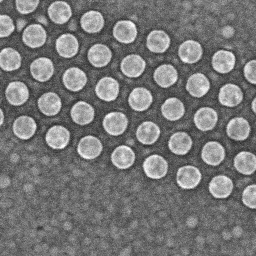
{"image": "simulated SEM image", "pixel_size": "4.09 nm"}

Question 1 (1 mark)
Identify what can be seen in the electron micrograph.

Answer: a regular array of raised bodies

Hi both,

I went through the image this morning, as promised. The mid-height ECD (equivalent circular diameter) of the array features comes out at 22.5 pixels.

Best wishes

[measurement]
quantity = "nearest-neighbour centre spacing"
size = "0.139 um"